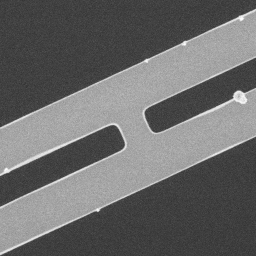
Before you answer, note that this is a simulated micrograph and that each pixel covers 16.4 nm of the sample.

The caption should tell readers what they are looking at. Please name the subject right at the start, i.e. groups of lines, slits or small figures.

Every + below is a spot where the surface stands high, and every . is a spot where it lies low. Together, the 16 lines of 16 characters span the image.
................
..............++
............++++
..........++++++
........++++++..
.....+++++++....
...+++++++....++
.++++++++...++++
+++++...++++++++
+++....+++++++..
+....+++++++....
...+++++++......
.++++++.........
+++++...........
+++.............
+...............